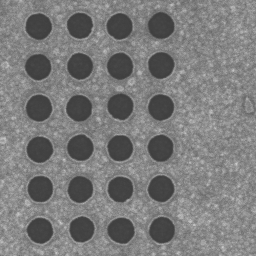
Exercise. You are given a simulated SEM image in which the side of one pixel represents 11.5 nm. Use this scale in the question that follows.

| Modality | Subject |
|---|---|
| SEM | a regular array of holes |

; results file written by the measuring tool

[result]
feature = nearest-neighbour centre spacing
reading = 459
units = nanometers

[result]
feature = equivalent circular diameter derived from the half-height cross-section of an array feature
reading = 306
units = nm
